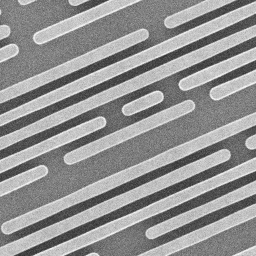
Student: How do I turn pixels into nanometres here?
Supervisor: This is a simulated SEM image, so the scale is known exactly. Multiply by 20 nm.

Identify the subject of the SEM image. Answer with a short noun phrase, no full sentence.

groups of lines, slits or small figures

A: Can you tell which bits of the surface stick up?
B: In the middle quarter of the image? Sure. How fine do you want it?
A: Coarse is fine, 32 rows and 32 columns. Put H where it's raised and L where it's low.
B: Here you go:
HHHHHHLLLLLLHHHHHHHLLLLLHHHHHHHH
HHHLLLLLLHHHHHHHLLLLLLHHHHHHHLLL
HLLLLLLHHHHHHHLLLLLLHHHHHHHLLLLL
LLLLHHHHHHHHLLLLLHHHHHHHHLLLLLHH
LLHHHHHHHHLLLLLHHHHHHHHLLLLLLHHH
HHHHHHHLLLLLLHHHHHHHLLLLLLLLLHHH
HHHHHLLLLLLHHHHHHHLLLLLLLLLLLLHL
HHHLLLLLLHHHHHHLLLLLLHHHHLLLLLLL
LLLLLLHHHHHHHLLLLLLHHHHHHLLLLLLL
LLLLHHHHHHHLLLLLLHHHHHHHLLLLLLHH
LLHHHHHHLLLLLLLHHHHHHHLLLLLHHHHH
HHHHHHLLLLLLLLLHHHHHLLLLLHHHHHHH
HHHHLLLLLLLLLLLHHLLLLLLHHHHHHHLL
HHLLLLLLHHLLLLLLLLLLLHHHHHHHLLLL
LLLLLLHHHHLLLLLLLLHHHHHHHHLLLLLL
LLLHHHHHHHLLLLLLHHHHHHHLLLLLLLLL
LHHHHHHHLLLLLLHHHHHHHLLLLLLLLLLL
HHHHHHLLLLLLHHHHHHHLLLLLLLLLLLLL
HHHHLLLLLLHHHHHHHLLLLLLLLLLLLLLL
HLLLLLLHHHHHHHLLLLLLLLLLLLLLLLLH
LLLLLHHHHHHHLLLLLLLLLLLLLLLLLHHH
LLLHHHHHHHLLLLLLLLLLLLLLLLHHHHHH
LHHHHHHHLLLLLLLLLLLLLLLLHHHHHHHH
HHHHHLLLLLLLLLLLLLLLLLHHHHHHHLLL
HHHLLLLLLLLLLLLLLLLLHHHHHHHLLLLL
LLLLLLLLLLLLLLLLLHHHHHHHLLLLLLHH
LLLLLLLLLLLLLLLHHHHHHHLLLLLLHHHH
LLLLLLLLLLLLLHHHHHHHLLLLLLHHHHHH
LLLLLLLLLLHHHHHHHHLLLLLLHHHHHHHL
LLLLLLLLHHHHHHHHLLLLLLHHHHHHLLLL
LLLLLLHHHHHHHLLLLLLHHHHHHHLLLLLL
LLLLHHHHHHHLLLLLLHHHHHHHLLLLLLHH